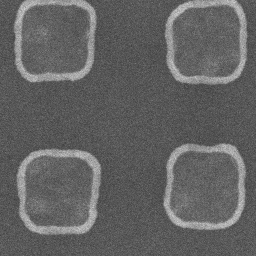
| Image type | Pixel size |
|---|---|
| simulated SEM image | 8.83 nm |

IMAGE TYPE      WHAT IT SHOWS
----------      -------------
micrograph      raised bodies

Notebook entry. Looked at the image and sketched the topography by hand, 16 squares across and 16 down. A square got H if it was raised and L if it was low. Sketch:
LHHHHHLLLLLHHHHL
LHHHHHLLLLLHHHHL
LHHHHHLLLLLHHHHL
LHHHHHLLLLLHHHHL
LHHHHLLLLLLHHHHL
LLLLLLLLLLLLLLLL
LLLLLLLLLLLLLLLL
LLLLLLLLLLLLLLLL
LLLLLLLLLLLLLLLL
LLLLLLLLLLLHHHHL
LHHHHHLLLLLHHHHL
LHHHHHLLLLLHHHHL
LHHHHHLLLLHHHHHL
LHHHHHLLLLLHHHHL
LLLLLLLLLLLLLLLL
LLLLLLLLLLLLLLLL